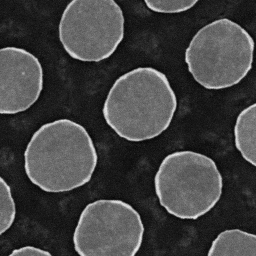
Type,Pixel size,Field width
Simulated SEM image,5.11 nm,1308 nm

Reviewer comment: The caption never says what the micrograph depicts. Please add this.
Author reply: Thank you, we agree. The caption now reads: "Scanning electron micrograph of raised bodies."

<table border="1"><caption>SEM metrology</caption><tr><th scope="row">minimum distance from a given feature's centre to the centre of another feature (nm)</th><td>478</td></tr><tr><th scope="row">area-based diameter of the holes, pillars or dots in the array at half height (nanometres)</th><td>351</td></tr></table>